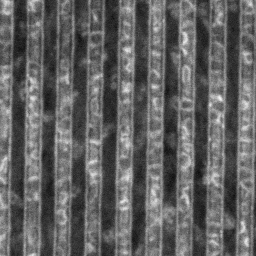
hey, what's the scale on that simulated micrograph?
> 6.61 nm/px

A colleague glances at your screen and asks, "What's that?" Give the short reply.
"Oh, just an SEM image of parallel lines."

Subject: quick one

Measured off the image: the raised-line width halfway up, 17 px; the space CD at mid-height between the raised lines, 0.0925 um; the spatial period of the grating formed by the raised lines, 201 nanometres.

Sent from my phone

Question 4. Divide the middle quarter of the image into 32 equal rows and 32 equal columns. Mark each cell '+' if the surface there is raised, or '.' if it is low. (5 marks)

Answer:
..++++....++++...++++....++++...
..++++....++++...++++....++++.+.
..++++....++++...++++....++++.+.
..++++....++++...++++....++++.+.
..++++....++++...++++....++++...
..++++....++++...++++....++++...
..++++....++++...++++....++++...
..++++...++++....++++....++++...
..++++...+++++...++++....++++...
..++++...+++++...++++....++++...
..++++.+.+++++...++++....++++...
..++++...+++++...++++....++++...
..++++...+++++...++++....++++...
..++++...+++++...++++....++++...
..++++...+++++...++++....++++...
..++++...+++++...++++....++++...
..++++...+++++...++++....++++...
..++++...+++++...++++....++++...
..++++...++++....++++....++++...
..++++...++++....++++....++++...
..++++...+++++...++++....++++...
..++++...+++++...++++....++++...
..++++...+++++...++++...+++++...
..++++...++++....++++...++++....
..++++...++++....++++...++++....
..++++...++++....++++...++++....
..++++...++++....++++...++++....
..++++...++++....++++...++++....
..++++...++++....++++...++++....
..++++...++++....++++...++++....
..++++...++++....++++...++++....
..++++...++++....++++...++++....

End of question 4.